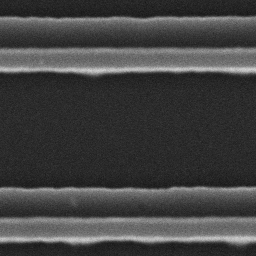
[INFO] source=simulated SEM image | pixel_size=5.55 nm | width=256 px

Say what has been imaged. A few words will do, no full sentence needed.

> lines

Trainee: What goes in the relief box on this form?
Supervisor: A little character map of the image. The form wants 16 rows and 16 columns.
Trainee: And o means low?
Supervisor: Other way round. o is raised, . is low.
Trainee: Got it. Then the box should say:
................
oooooooooooooooo
oooooooooooooooo
oooooooooooooooo
................
................
................
................
................
................
................
................
oooooooooooooooo
oooooooooooooooo
oooooooooooooooo
................